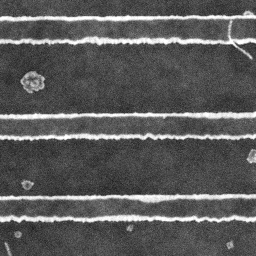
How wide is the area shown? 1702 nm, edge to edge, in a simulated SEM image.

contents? lines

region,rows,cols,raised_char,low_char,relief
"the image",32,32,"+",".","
................................
................................
++++++++++++++++++++++++++++++++
++++++++++++++++++++++++++++++++
++++++++++++++++++++++++++++++++
................................
................................
................................
................................
................................
................................
................................
................................
................................
.+.+++++++++++++++++++++++++++++
++++++++++++++++++++++++++++++++
++++++++++++++++++++++++++++++++
................................
................................
................................
................................
................................
................................
................................
............................++++
++++++++++++++++++++++++++++++++
++++++++++++++++++++++++++++++++
..+.......++..............++....
................................
................................
................................
................................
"